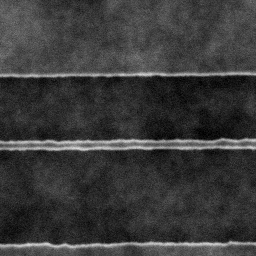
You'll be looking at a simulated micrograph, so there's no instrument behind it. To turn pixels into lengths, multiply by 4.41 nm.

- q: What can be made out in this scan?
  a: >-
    lines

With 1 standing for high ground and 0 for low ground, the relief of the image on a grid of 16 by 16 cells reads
1111111111111111
1111111111111111
1111111111111111
1111111111111111
1111111111111111
0000000000000000
0000000000000000
0000000000000000
0000000000000000
0000000000000000
0000000000000000
0000000000000000
0000000000000000
0000000000000000
0000000000000000
1111111111111111